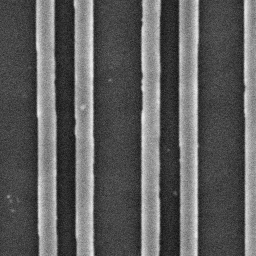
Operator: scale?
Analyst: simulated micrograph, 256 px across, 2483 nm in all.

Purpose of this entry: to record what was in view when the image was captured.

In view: lines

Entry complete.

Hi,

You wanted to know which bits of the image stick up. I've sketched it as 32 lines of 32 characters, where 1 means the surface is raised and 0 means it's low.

00000110011100000011001110000001
00000110011000000011001110000001
00000110011000000011001110000001
00000110011000000011001110000001
00000110011000000011001110000001
00000110011000000011001110000001
00000110011000000011001110000001
00000110011100000011001110000001
00000110011100000011001110000001
00000110011100000011001110000001
00000110011100000011001110000001
00000110011100000011001110000001
00000110011100000011001110000001
00000110011100000011001110000001
00000110011100000011001110000001
00000110001100000011001110000001
00000110011100000011001110000001
00000110001100000011001110000001
00000110001100000011001110000001
00000110001100000011000110000001
00000110001100000011000110000001
00000110001100000011000110000001
00000110001100000011000110000001
00000110001100000011000110000001
00000110001100000011000110000001
00000110001100000011000110000001
00000110001100000011000110000001
00000110001100000011000110000001
00000110001100000011000110000001
00000110001100000011000100000001
00000110001100000011000100000001
00000110001100000011000100000001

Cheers